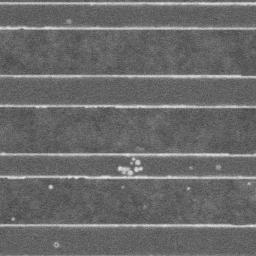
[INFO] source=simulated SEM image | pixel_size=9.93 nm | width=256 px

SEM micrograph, lines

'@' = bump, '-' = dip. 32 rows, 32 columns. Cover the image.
@@@@@@@@@@@@@@@@@@@@@@@@@--@@@-@
@@@@@@@@@@@@@@@@@@@@@@@@@@@@@@@@
@@@@@@@@@@@@@@@@@@@@@@@@@@@@@@@@
@@-@@@@@@@@@@@@@@@@@@@@@@@@@@@@@
--------------------------------
--------------------------------
--------------------------------
--------------------------------
--------------------------------
@@@@@@@@@@@@@@@@@@@@@@@@-@@-----
@@@@@@@@@@@@@@@@@@@@@@@@@@@@@@@@
@@@@@@@@@@@@@@@@@@@@@@@@@@@@@@@@
@@@@@@@@@@@@@@@@@@@@@@@@@@@@@@@@
--------------------------------
--------------------------------
--------------------------------
--------------------------------
--------------------------------
--------------------------------
@@@@@@@@@@@@@@@@@@@@@@@@@@@@@@@@
@@@@@@@@@@@@@@@@@@@@@@@@@@@@@@@@
@@@@@@@@@@@@@@@@@@@@@@@@@@@@@@@@
--------------------------------
--------------------------------
--------------------------------
--------------------------------
--------------------------------
--------------------------------
@@@@@@@@@@@@@@@@@@@@@@@@@@@@@@@@
@@@@@@@@@@@@@@@@@@@@@@@@@@@@@@@@
@@@@@@@@@@@@@@@@@@@@@@@@@@@@@@@@
@@@@@@@@@@@@@@@@@@@@@@@@@@@@@@@@